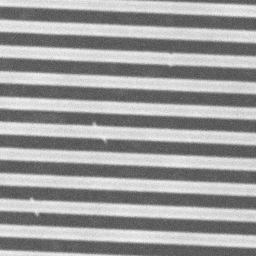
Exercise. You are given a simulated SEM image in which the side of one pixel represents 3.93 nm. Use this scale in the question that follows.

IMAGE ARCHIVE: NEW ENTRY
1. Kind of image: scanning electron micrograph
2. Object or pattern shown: parallel lines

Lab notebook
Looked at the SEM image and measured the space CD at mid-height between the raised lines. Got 57.8 nm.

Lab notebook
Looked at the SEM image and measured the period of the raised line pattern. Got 100 nm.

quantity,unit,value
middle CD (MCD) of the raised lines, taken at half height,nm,44.1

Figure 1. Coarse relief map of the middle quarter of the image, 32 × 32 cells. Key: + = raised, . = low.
................................
................................
................................
+++++++++++++++++++.............
++++++++++++++++++++++++++++++++
....++++++++++++++++++++++++++++
...........................+++++
................................
................................
++++++....+.....................
+++++++++++++++++++++++++++++++.
++++++++++++++++++++++++++++++++
....................++++++++++++
................................
................................
++++...+........................
+++++++++++++++++++++++++++.....
++++++++++++++++++++++++++++++++
.........++..+++++++++++++++++++
................................
................................
................................
+++++++++++++++.................
++++++++++++++++++++++++++++++++
++++++++++++++++++++++++++++++++
.......................+++++++++
................................
................................
+++++++.........................
++++++++++++++++++++++++++++++..
++++++++++++++++++++++++++++++++
................++++++++++++++++